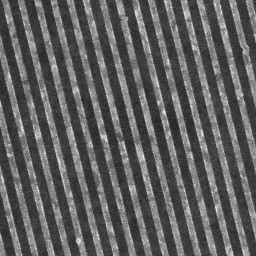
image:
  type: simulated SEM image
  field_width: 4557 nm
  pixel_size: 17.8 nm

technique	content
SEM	parallel lines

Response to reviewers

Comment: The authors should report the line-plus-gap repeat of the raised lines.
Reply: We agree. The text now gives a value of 281 nm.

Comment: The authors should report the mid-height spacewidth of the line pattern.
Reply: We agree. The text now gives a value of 179 nm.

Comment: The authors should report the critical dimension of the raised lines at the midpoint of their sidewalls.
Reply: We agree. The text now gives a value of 106 nm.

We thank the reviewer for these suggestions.